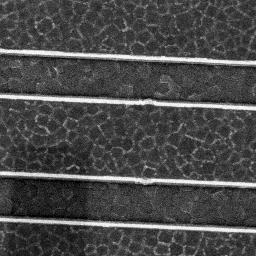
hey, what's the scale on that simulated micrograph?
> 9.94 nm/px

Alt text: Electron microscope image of one or a few lines or trenches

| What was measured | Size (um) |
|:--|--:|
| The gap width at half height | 0.45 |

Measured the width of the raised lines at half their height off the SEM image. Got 759 nm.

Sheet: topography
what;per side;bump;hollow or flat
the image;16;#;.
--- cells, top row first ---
################
################
################
.......#########
................
................
##########......
################
################
################
################
...............#
................
................
################
################